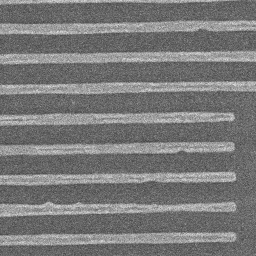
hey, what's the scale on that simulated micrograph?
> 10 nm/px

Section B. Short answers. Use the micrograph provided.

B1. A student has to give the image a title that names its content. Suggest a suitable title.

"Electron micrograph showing parallel lines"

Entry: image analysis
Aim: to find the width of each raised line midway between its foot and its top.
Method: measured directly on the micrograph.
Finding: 94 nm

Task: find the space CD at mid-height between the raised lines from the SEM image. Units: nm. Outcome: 217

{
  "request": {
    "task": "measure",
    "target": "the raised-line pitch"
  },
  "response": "302 nm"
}